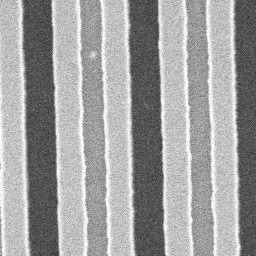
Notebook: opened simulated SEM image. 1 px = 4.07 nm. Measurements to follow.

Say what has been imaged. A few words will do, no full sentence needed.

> lines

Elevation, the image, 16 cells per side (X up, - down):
X--XXXXX--XXXXX-
X--XXXXX--XXXXX-
X--XXXXX--XXXXX-
X--XXXXX--XXXXX-
X--XXXXX--XXXXX-
X--XXXXX--XXXXX-
X--XXXXX--XXXXX-
X---XXXX--XXXXX-
XX--XXXX--XXXXX-
XX--XXXX--XXXXX-
XX--XXXX--XXXXX-
XX--XXXX--XXXXX-
XX--XXXX--XXXXX-
XX--XXXX--XXXXX-
XX--XXXX--XXXXX-
XX--XXXX--XXXXX-